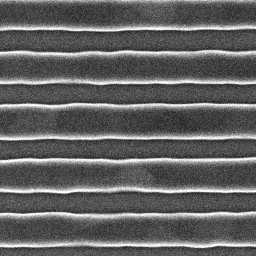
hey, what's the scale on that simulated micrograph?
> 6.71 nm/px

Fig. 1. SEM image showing wiring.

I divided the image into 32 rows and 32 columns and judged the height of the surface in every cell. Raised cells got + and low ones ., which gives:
++++++++++++++++++++++++++++++++
++++++++++++++++++++++++++++++++
++++++++++++++++++++++++++++++++
++++++++++++++++++++++++++++++..
................................
................................
...............++........+++....
++++++++++++++++++++++++++++++++
++++++++++++++++++++++++++++++++
++++++++++++++++++++++++++++++++
................................
................................
................................
++++++++++++++++++++++++++++++++
++++++++++++++++++++++++++++++++
++++++++++++++++++++++++++++++++
++++++++++++++++++++++++++++++++
................................
................................
................................
++++++++++++++++++++++++++++++++
++++++++++++++++++++++++++++++++
++++++++++++++++++++++++++++++++
++++++++++++++++++++++++++++++++
................................
................................
................................
++++++++++++++++++++++++++++++++
++++++++++++++++++++++++++++++++
++++++++++++++++++++++++++++++++
++++++++++++++++++++++++++++++++
................................